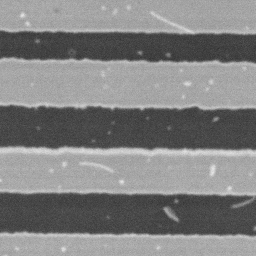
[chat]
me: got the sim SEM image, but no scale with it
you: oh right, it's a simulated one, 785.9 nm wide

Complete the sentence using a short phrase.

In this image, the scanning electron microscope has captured lines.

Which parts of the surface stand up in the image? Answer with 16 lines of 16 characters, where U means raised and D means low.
UUUUUUUUUUUUUUUU
UUUUUUUUUUUUUUUU
DDDDDDDDDDDDDDDD
DDDDDDDDDDDDDDDD
UUUUUUUUUUUUUUUU
UUUUUUUUUUUUUUUU
UUUUUUUUUUUUUUUU
DDDDDDDDDDDDDDDD
DDDDDDDDDDDDDDDD
UUUUUUUUUUUUUUUU
UUUUUUUUUUUUUUUU
UUUUUUUUUUUUUUUU
DDDDDDDDDDDDDDDD
DDDDDDDDDDDDDDDD
DDDDDDDDDDDDDDDD
UUUUUUUUUUUUUUUU